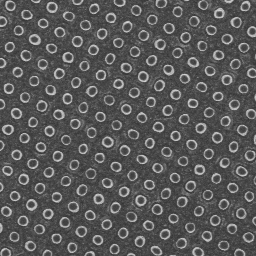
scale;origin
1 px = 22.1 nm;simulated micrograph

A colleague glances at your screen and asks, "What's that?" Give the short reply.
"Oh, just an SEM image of a regular array of raised bodies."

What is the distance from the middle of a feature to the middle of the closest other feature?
400 nm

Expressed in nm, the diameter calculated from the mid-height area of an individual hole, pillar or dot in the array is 215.